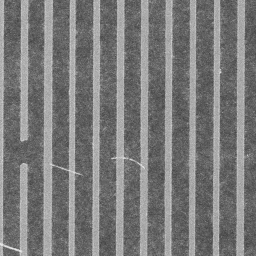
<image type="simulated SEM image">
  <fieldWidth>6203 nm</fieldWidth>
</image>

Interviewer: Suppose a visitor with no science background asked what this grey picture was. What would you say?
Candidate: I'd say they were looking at parallel lines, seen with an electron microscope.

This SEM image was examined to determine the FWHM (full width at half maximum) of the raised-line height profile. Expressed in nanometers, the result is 154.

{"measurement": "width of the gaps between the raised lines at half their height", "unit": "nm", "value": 424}